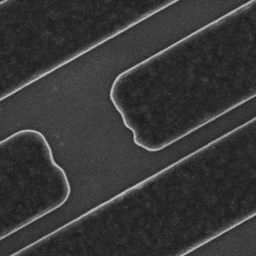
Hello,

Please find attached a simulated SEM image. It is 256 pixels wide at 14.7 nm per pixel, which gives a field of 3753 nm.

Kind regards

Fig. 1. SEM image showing one or a few lines or trenches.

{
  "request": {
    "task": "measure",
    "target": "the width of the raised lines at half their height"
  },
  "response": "1230 nm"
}